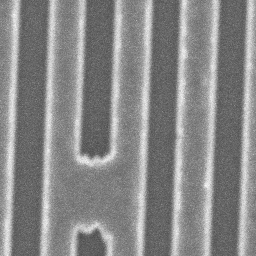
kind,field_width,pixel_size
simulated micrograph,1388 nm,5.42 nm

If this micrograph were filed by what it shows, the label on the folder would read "one or a few lines or trenches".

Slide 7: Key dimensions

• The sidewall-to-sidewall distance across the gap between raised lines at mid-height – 181 nm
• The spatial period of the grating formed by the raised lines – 358 nm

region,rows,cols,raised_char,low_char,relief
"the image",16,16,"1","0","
1001100110011100
1001100110011000
1001100110011000
1001100110011000
1001100110011001
1001100110011001
1001100110011001
1001100110011001
1001100110011001
1001100110011001
1001111110011001
1001111110011001
1001111110011001
1001111110011001
1001101110011001
1001100110011001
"